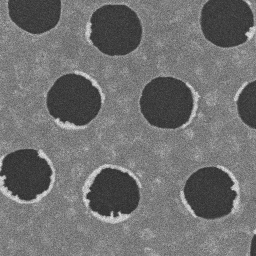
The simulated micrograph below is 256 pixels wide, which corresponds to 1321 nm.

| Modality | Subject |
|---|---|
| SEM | holes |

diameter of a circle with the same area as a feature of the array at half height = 0.269 micrometres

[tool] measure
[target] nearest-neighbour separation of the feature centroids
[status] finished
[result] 458 nm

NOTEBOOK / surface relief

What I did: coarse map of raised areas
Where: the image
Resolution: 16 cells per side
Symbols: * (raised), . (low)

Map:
*...**..*****...
*..***...****...
******...****..*
****************
****************
***...***...***.
***...***...***.
****..***...***.
****************
*.**************
...*************
...***...***...*
******...***...*
*************.**
****************
****************